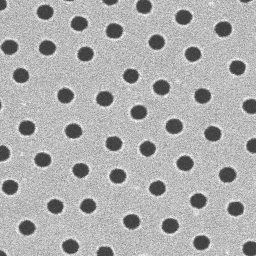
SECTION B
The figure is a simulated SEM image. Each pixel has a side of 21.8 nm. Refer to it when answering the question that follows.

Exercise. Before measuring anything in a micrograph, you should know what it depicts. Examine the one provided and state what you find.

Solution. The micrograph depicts a regular array of holes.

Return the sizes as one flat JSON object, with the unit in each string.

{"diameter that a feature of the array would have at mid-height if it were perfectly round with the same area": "0.37 microns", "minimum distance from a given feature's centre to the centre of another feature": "0.779 microns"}